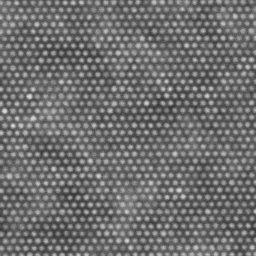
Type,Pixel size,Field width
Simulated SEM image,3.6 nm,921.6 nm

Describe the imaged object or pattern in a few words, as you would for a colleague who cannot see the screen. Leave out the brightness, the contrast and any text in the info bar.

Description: a regular array of raised bodies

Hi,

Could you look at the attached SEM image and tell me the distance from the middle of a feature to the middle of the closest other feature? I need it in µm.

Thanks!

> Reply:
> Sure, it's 0.0276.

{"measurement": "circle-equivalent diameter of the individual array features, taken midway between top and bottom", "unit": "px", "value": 4.22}